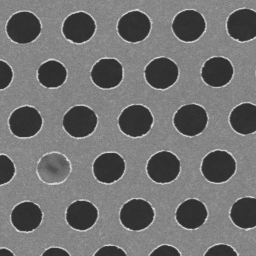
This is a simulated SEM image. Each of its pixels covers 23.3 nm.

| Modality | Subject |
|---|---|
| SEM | a regular array of holes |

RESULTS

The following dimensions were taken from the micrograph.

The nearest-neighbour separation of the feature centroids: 1260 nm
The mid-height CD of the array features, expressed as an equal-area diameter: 754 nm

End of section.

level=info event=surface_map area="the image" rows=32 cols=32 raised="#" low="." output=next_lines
################################
################.######..####...
#....###....###....###....##....
#....###....###....###....##....
#....###...####...####...####...
################################
################################
#############..####..#####..####
.####...####...###....###....###
..###...###....###....###....###
.####...####...####...####..####
################################
################################
###.#####..#####..#####..####...
#....###....###....###....###...
#....###....###....###....###...
##...###....###...####...#####..
################################
################################
.###########...####...####...###
..##########....##.....##....###
..##########...###....###....###
.###########...####...####..####
################################
################################
##..#####...####...####..####...
##...###....###....###....###...
#....###....###....###....###...
##..#####..#####..#####..#####.#
################################
################################
.#####..####....###...####...###